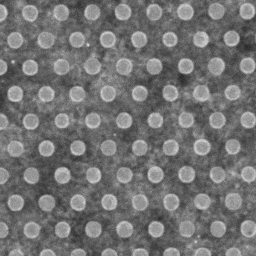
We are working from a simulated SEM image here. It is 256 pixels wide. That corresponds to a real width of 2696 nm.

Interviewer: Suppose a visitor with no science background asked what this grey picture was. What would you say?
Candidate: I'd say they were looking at a regular array of raised bodies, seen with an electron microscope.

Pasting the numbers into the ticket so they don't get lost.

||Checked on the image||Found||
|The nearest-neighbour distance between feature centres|324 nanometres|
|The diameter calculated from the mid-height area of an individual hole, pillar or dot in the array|160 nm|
